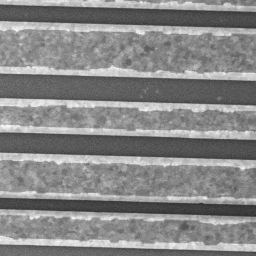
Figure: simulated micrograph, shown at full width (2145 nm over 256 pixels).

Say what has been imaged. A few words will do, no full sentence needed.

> one or a few lines or trenches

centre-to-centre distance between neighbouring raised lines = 0.502 µm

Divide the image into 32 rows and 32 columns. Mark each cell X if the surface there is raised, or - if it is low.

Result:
-----------XXXXXXXXXXXXXXXXXXXXX
--------------------------------
--------------------------------
XXXXXXXXXXXXX-------------------
XXXXXXXXXXXXXXXXXXXXXXXXXXXXXXXX
XXXXXXXXXXXXXXXXXXXXXXXXXXXXXXXX
XXXXXXXXXXXXXXXXXXXXXXXXXXXXXXXX
XXXXXXXXXXXXXXXXXXXXXXXXXXXXXXXX
XXXXXXXXXXXXXXXXXXXXXXXXXXXXXXXX
---------------------------XXXXX
--------------------------------
--------------------------------
--------------------------------
XXXXXXXXXXXXXXXXXXXXXXXXXXXX----
XXXXXXXXXXXXXXXXXXXXXXXXXXXXXXXX
XXXXXXXXXXXXXXXXXXXXXXXXXXXXXXXX
-------------XXXXXXXXXXXXXXXXXXX
--------------------------------
--------------------------------
--------------------------------
XXXXXXXXXXXXXXXXXXXXXXXXXXXXXXXX
XXXXXXXXXXXXXXXXXXXXXXXXXXXXXXXX
XXXXXXXXXXXXXXXXXXXXXXXXXXXXXXXX
XXXXXXXXXXXXXXXXXXXXXXXXXXXXXXXX
------XXXXXXXXXXXXXXXXXXXXXXXXXX
--------------------------------
--------------------------------
XXXXXXXXXXXXXXXXXXXXXXXXXXXXXXX-
XXXXXXXXXXXXXXXXXXXXXXXXXXXXXXXX
XXXXXXXXXXXXXXXXXXXXXXXXXXXXXXXX
------------XXXXXXXXXXXXXXXXXXXX
--------------------------------